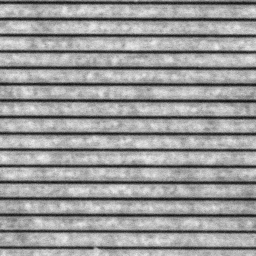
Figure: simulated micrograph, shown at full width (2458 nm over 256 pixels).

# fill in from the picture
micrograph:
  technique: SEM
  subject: parallel lines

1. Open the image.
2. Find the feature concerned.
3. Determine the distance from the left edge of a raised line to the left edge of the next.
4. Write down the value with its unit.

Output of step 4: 0.157 um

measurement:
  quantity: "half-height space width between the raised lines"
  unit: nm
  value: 42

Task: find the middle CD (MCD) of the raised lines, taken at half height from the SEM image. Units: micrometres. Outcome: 0.116